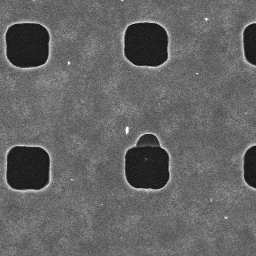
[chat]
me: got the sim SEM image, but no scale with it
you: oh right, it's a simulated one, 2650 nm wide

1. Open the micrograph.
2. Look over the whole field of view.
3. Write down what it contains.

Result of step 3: holes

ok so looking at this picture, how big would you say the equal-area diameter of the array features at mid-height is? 0.483 micrometres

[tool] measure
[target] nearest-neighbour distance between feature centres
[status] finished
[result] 1.23 microns